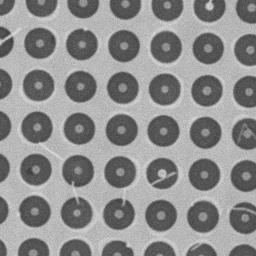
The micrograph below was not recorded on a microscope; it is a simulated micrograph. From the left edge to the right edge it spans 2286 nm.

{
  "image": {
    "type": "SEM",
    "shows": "an array of small figures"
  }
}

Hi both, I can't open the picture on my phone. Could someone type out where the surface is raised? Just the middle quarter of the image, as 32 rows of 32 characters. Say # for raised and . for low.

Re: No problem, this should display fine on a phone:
################################
###.############################
#......######....#######...#####
#.......###.......####......####
........###.......####.......###
....#...###...#....##........###
........###...#....##.........##
#.......###........##........###
#......#####.......##........###
##...########.....####......####
########################...#####
################################
##...#######....################
#......####......#####.....#####
.......####.......###.......####
........##........###........##.
...#....##...##....##...#....##.
........##........###........##.
.......####.......###........###
#.....######.....####.......####
##############..#######....#####
################################
################################
#.....######....########..######
.......####.......###......#####
.......###........###.......####
........##...##....#....#....##.
........##...##....#....#....##.
.......###........###........##.
#......####.......###.......###.
###..#######.....#####.....#####
########################.#######